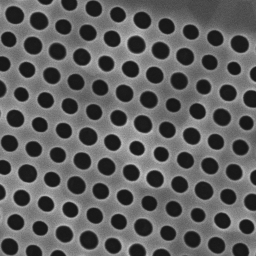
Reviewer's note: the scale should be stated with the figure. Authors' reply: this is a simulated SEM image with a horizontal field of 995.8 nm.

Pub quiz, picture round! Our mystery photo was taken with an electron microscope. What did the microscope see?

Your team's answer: a regular array of holes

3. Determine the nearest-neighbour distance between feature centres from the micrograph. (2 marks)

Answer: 97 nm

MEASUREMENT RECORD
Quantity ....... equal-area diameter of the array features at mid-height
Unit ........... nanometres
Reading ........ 62.5